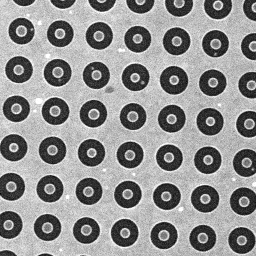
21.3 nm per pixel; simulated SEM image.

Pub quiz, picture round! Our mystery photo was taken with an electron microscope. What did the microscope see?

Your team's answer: an array of small figures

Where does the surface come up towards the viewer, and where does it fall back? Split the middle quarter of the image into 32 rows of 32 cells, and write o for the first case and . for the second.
..oooo.....ooooo....ooooooo.oooo
..ooo......oooo......oooo.....oo
..ooo..oo...oo.......ooo.......o
..ooo..oo...oo...oo...oo...o...o
.oooo......ooo.......ooo...o...o
oooooo....ooooo......ooo.......o
oooooooooooooooo...oooooo.....oo
oooooooooooooooooooooooooo...ooo
oooooooooooooooooooooooooooooooo
.oooo....ooooooooooooooooooooooo
.ooo......ooooo....oooooo....ooo
..oo...o...ooo......oooo......oo
.ooo..ooo..ooo..oo...ooo......oo
.ooo...o...ooo..oo...oo...oo...o
oooo......oooo......ooo...oo..oo
ooooo....oooooo.....oooo......oo
oooooooooooooooo..ooooooo....ooo
oooooooooooooooooooooooooooooooo
oooooooooooooooooooooooooooooooo
ooooo....oooooo...oooooooooooooo
oooo......oooo.....ooooo....oooo
.oo...oo..ooo.......ooo......ooo
.oo...oo...oo..ooo..ooo...o...oo
oooo......ooo...o...ooo..oo...oo
oooo......ooo.......ooo.......oo
oooooo..oooooo.....ooooo.....ooo
ooooooooooooooooooooooooo...oooo
oooooooooooooooooooooooooooooooo
ooooo..ooooooooooooooooooooooooo
oooo.....ooooo....oooooooooooooo
ooo......oooo......oooo.....oooo
ooo..oo...ooo......ooo.......ooo